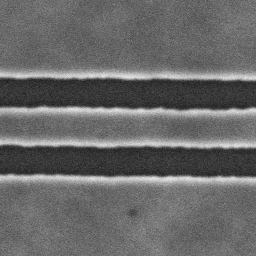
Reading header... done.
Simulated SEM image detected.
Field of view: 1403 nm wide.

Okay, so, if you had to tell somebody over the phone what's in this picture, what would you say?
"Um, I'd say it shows lines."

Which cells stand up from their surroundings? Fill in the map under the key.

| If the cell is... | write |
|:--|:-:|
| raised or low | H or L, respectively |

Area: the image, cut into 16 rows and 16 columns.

HHHHHHHHHHHHHHHH
HHHHHHHHHHHHHHHH
HHHHHHHHHHHHHHHH
HHHHHHHHHHHHHHHH
HHHHHHHHHHHHHHHH
LLLLLLLLLLLLLLLL
LLLLLLLLLLLLLLLL
HHHHHHHHHHHHHHHH
HHHHHHHHHHHHHHHH
LLLLLLLLLLLLLLLL
LLLLLLLLLLLLLLLL
HHHHHHHHHHHHHHHH
HHHHHHHHHHHHHHHH
HHHHHHHHHHHHHHHH
HHHHHHHHHHHHHHHH
HHHHHHHHHHHHHHHH